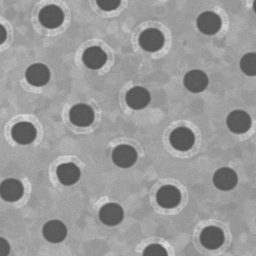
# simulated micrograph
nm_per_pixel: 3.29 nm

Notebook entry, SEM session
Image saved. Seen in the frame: a regular array of holes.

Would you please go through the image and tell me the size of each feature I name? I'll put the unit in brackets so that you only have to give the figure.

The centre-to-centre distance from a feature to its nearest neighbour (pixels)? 59.3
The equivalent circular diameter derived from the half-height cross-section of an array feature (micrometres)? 0.082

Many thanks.